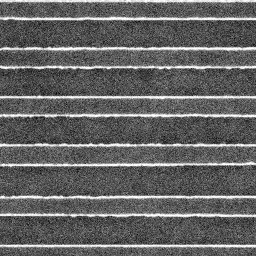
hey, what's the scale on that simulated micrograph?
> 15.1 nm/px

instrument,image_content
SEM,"lines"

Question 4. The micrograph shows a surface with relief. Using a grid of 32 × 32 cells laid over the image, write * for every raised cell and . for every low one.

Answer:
********************************
********************************
................................
................................
................................
................................
********************************
********************************
................................
................................
................................
................................
********************************
********************************
.***.**.*******....*****.*******
................................
................................
................................
********************************
********************************
********************************
................................
................................
................................
................................
********************************
********************************
................................
................................
................................
................................
********************************